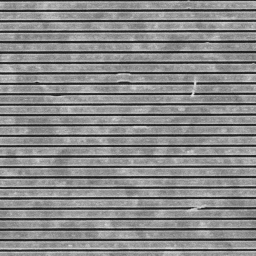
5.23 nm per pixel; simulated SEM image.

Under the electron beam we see parallel lines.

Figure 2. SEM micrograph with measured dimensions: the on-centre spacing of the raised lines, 54.5 nanometers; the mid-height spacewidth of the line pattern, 14.4 nanometers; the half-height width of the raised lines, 37.9 nanometers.